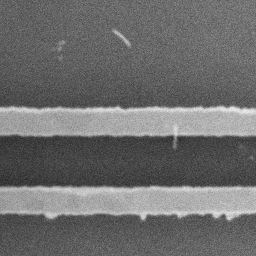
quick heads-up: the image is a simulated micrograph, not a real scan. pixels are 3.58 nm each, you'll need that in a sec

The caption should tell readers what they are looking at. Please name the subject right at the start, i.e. lines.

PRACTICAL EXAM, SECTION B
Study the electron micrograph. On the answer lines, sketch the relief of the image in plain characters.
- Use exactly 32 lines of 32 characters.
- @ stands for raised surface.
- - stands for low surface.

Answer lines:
--------------------------------
--------------------------------
--------------------------------
--------------------------------
--------------------------------
--------------------------------
--------------------------------
--------------------------------
--------------------------------
--------------------------------
--------------------------------
--------------------------------
--------------------------------
@@@@---@----@@@---@@@-@-@@@@@@--
@@@@@@@@@@@@@@@@@@@@@@@@@@@@@@@@
@@@@@@@@@@@@@@@@@@@@@@@@@@@@@@@@
@@@@@@@@@@@@@@@@@@@@@@@@@@@@@@@@
--------------------------------
--------------------------------
--------------------------------
--------------------------------
--------------------------------
--------------------------------
@@@@@@@@@-@-@@@--@@@@@@@@@@@@@@@
@@@@@@@@@@@@@@@@@@@@@@@@@@@@@@@@
@@@@@@@@@@@@@@@@@@@@@@@@@@@@@@@@
@@@@@@@@@@@@@@@@@@@@@@@@@@@@@@@@
--------------------------------
--------------------------------
--------------------------------
--------------------------------
--------------------------------